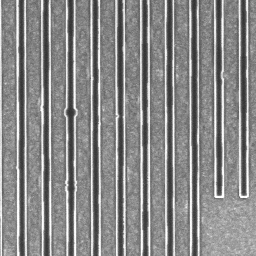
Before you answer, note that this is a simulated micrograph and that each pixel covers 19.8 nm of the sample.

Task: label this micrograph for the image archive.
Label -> parallel lines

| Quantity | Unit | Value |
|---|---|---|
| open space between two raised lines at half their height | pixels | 16.6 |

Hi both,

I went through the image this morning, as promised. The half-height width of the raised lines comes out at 7.87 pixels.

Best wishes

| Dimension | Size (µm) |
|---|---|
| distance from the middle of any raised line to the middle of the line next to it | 0.487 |